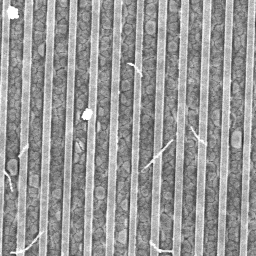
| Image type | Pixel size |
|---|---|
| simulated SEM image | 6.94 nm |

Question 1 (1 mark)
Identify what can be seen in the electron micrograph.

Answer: parallel lines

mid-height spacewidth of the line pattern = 105 nm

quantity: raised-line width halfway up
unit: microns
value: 0.046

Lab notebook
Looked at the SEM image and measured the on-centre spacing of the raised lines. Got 0.154 microns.